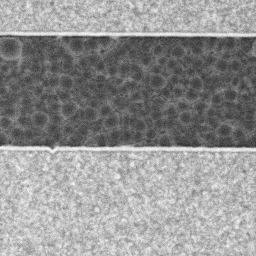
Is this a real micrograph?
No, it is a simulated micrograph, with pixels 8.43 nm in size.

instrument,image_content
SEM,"one or a few lines or trenches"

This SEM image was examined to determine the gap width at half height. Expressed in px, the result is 115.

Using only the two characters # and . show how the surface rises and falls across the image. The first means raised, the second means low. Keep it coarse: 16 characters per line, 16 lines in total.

################
################
#...............
................
................
................
................
................
................
################
################
################
################
################
################
################